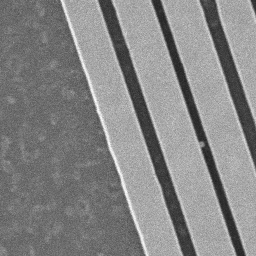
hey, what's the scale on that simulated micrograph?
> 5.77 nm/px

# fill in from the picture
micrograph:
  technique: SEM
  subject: parallel lines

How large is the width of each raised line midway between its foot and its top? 208 nanometers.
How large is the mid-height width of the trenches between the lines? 78.7 nanometers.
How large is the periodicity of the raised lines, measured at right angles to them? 280 nanometers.